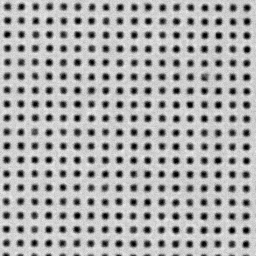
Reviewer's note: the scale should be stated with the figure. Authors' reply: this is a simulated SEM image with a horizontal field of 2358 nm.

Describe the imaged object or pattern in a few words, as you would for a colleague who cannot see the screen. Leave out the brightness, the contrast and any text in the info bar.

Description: a regular array of holes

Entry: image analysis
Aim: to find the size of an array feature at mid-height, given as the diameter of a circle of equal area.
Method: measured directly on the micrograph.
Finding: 0.0764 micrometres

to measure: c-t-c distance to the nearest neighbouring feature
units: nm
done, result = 126